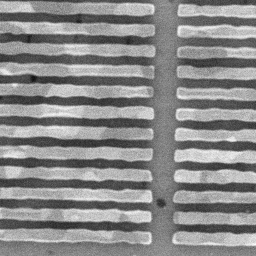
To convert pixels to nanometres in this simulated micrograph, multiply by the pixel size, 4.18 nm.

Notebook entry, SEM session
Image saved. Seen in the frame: groups of lines, slits or small figures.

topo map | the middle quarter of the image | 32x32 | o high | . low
o.oooooooooo..oooooo.........ooo
oooooooooooooooooooooo......oooo
oooooooooooooooooooooo......oooo
.....................o..........
................................
ooo.............................
oooooooooooooooooooooo......oooo
oooooooooooooooooooooo......oooo
........oo......................
................................
....ooo.........................
oooooooooooooooooooooo......oooo
oooooooooooooooooooooo......oooo
.....ooooooo....oooooo......oooo
................................
................................
oooooooooooooooooooooo......ooo.
oooooooooooooooooooooo......oooo
ooooooooooo..ooooooooo......oooo
................................
................................
oooooooooooooooooooooo.........o
oooooooooooooooooooooo......oooo
o..ooooo..oooooooooooo......oooo
................................
................................
ooooooooo.oooo.ooo..............
oooooooooooooooooooooo......oooo
oooooooooooooooooooooo......oooo
...............................o
................................
oooooo..........................